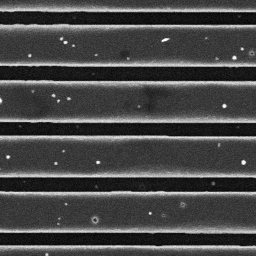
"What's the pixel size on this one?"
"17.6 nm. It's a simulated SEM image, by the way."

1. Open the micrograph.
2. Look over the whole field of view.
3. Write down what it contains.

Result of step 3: lines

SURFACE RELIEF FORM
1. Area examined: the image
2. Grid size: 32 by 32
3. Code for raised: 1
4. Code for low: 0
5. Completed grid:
11111111111111111111111111111111
00000000000000000000000000000000
00000000000000000000000000000000
11111111111111111111111111111111
11111111111111111111111111111111
11111111111111111111111111111111
11111111111111111111111111111111
11111111111111111111111111111111
00000000000000000000000000000000
00000000000000000000000000000000
11111111111111111111111111111111
11111111111111111111111111111111
11111111111111111111111111111111
11111111111111111111111111111111
11111111111111111111111111111111
00000000000000000000000000000000
00000000000000000000000000000000
11111111111111111111111111111111
11111111111111111111111111111111
11111111111111111111111111111111
11111111111111111111111111111111
11111111111111111111111111111111
00000000000000000000000000000000
00000000000000000000000000000000
11111111111111111111111111111111
11111111111111111111111111111111
11111111111111111111111111111111
11111111111111111111111111111111
11111111111111111111111111111111
00000000000000000000000000000000
00000000000000000000000000000000
11111111111111111111111111111111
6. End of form